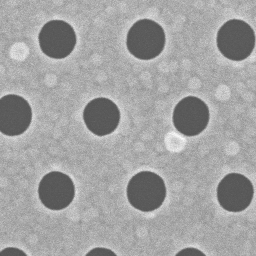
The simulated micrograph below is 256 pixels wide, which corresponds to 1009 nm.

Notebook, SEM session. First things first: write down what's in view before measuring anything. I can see a regular array of holes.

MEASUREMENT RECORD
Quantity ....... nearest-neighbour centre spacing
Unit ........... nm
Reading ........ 346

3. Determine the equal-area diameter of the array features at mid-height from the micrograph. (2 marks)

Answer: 153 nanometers